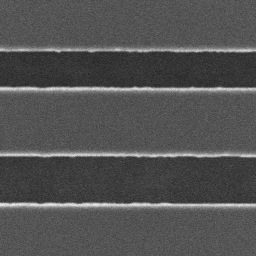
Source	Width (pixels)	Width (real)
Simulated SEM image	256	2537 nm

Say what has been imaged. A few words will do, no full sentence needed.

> lines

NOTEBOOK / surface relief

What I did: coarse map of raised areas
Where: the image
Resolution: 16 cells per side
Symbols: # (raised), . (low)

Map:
################
################
################
................
................
##.#.#..........
################
################
################
################
................
................
................
################
################
################